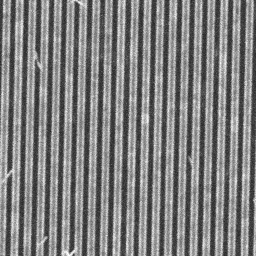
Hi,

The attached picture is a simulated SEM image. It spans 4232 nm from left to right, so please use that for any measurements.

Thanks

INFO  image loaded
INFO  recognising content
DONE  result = parallel lines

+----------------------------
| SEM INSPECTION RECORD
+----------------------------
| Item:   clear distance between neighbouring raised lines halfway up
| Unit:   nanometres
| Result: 124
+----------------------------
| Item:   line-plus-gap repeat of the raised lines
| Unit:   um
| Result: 0.211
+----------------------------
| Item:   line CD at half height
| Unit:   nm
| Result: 93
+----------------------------